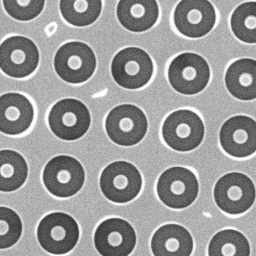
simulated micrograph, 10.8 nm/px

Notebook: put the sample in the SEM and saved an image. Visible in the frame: an array of small figures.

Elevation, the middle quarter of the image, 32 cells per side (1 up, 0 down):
01110000111100001110000111000000
00000000111100011100000111000011
00000001111100001100001111000011
00000011111100000000001111000001
00000111111110000000011111000000
11111111111111000000111111100000
11111111111111111111111111110000
11111111111111111111111111111100
11111111111111111111111111111111
00001111111111111111111111111111
00000011111110000011111111111111
00000011111100000000111111110000
01000001111000000000111111000000
11100001110000000000011110000000
11100001110000111000011110000000
00000001110000111000011100000110
00000011110000010000011100001110
00000111111000000000011100000110
00001111111000000000111100000000
11111111111100000001111110000000
11111111111111100111111111000000
11111111111111111111111111100000
11111111111111111111111111111111
00011111111111111111111111111111
00001111111100001111111111111111
00000111111000000011111111111111
00000111110000000001111110000000
10000111100000000001111100000000
10000111100001100000111000000000
00000111100011110000111000001000
00000111100001100000111000011100
00001111100000000001111000011100